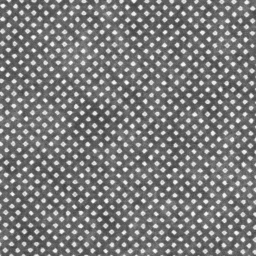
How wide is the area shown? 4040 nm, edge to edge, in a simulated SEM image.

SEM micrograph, a regular array of raised bodies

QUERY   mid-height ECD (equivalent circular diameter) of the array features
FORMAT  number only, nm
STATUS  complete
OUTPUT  61.7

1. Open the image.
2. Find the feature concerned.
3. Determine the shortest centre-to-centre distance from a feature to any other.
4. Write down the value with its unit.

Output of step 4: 134 nanometers